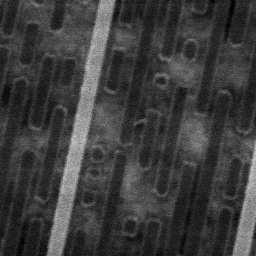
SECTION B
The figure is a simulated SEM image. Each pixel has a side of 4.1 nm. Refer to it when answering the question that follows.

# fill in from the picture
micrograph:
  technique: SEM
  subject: parallel lines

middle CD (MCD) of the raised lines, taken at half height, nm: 58.1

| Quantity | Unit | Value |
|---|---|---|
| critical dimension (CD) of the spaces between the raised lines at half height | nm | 35.1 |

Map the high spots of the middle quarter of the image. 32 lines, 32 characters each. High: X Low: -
XXX---XXX--XXXX--XXXX-----------
XXX---XXX--XXXX--XXXX-----------
XXX--XXXX--XXX---XXX------------
XX---XXXX--XXX---XXX---XXX------
XX---XXX--XXXX---XXX--XXXX------
XX---XXX--XXXX--XXXX----X---XX--
----XXXX---XX---XXXX--------XXX-
----XXXX--------XXX---------XXX-
----XXXX--------XXX--------XXXX-
----XXX--------XXXX--------XXXX-
----XXX--------XXXX--------XXX--
---XXXX--------XXXX--X-----XXX--
---XXXX--------XXX---XXX--XXXX--
---XXXX--------XXX--XXXX--XXXX--
---XXX--------XXXXX-XXXX--XXXX--
---XXX--------XXXX--XXXX--XXX---
--XXXX--------XXXX--XXX---XXX---
--XXXX--------XXX---XXX--XXXX---
--XXXX-------XXXX--XXXX--XXXX---
--XXX---------XXX--XXXX--XXXX---
--XXX---X----------XXXX--XXX----
-XXXX--XXX---------XXX---XXX----
-XXXX--XXX---XXX---XXX--XXXX----
-XXX---XXX---XXX--XXXX--XXXX----
-XXX--------XXXX--XXXX--XXX---X-
-XXX--------XXXX---XX---XXX---XX
XXXX--XXX---XXX---------XXX--XXX
XXXX--XXX---XXX--------XXXX--XXX
XXX----X----XXX--------XXXX--XXX
XXX--------XXXX--------XXX---XXX
XXX--------XXXX--------XXX---XXX
XXX--X-----XXX---------XXX--XXXX